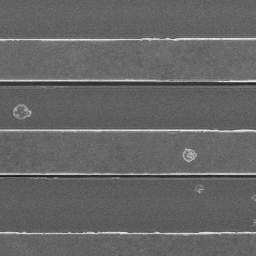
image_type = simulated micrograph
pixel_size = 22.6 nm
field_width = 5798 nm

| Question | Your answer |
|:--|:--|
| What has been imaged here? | lines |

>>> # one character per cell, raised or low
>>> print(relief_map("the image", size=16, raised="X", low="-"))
----------------
----------------
XXXXXXXXXXXXXXXX
XXXXXXXXXXXXXXXX
XXXXXXXXXXXXXXXX
----------------
----------------
----------------
XXXXXXXXXXXXXXXX
XXXXXXXXXXXXXXXX
XXXXXXXXXXXXXXXX
----------------
----------------
----------------
----------------
XXXXXXXXXXXXXXXX